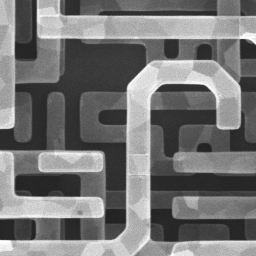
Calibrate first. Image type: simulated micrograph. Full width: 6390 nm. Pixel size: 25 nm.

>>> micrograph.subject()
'wiring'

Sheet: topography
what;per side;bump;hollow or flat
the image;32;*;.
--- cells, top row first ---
**...**....................***..
**...***...................***..
**...***************************
**...***************************
**...***************************
**...**....................***..
**...**....................***..
**..***....................***..
*******...........************..
*******..........*************..
**..............*****....*****..
**..............***........***..
**..............***........***..
**..............***........***..
**..............***........***..
**..............***........***..
................***.............
................***.............
................***.............
*************...***...**********
*************...***...**********
*************...***...**********
**........***...***.............
**........***...***.............
***.......***...***.............
*************...***...**********
*************...***...**********
....****..***...***.............
.....**...***...***.............
....***...***..****.............
********************************
********************************